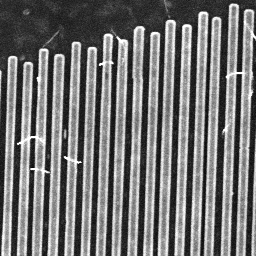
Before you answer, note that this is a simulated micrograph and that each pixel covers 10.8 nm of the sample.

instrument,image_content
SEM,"parallel lines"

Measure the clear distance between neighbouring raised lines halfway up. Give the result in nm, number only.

86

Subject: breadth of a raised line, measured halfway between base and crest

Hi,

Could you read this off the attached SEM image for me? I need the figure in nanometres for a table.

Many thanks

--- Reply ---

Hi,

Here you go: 86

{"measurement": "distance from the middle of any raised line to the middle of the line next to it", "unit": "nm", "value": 168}